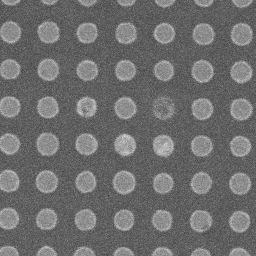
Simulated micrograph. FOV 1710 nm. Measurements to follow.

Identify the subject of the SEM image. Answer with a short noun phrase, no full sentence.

a regular array of raised bodies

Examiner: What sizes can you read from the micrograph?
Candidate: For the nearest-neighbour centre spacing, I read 250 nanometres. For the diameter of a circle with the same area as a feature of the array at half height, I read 20.2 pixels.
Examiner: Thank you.